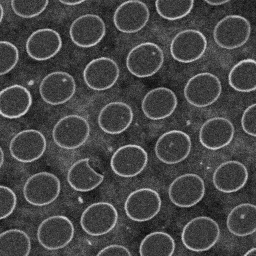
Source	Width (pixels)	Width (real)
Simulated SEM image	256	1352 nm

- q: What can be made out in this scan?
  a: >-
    a regular array of raised bodies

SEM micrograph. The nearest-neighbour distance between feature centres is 240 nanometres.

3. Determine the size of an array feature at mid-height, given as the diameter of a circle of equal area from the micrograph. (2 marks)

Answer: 180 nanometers